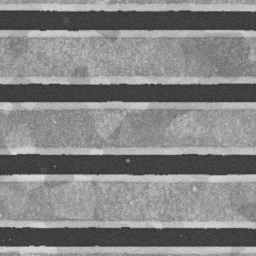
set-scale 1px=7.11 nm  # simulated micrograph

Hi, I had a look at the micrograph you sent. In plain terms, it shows lines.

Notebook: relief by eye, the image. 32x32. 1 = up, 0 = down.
11111111111111111111111111111111
00000000000000000000000000000000
00000000000000000000000000000000
00000000000000000000000000000000
11111111111111111111111111111111
11111111111111111111111111111111
11111111111111111111111111111111
11111111111111111111111111111111
11111111111111111111111111111111
11111111111111111111111111111111
00000000000000000000000000000000
00000000000000000000000000000000
00000000000000000000000000000000
11111111111111111111111111111111
11111111111111111111111111111111
11111111111111111111111111111111
11111111111111111111111111111111
11111111111111111111111111111111
11111111111111111111111111111111
00000000000000000000000000000000
00000000000000000000000000000000
00000000000000000000000000000000
11111111111111111111111111111111
11111111111111111111111111111111
11111111111111111111111111111111
11111111111111111111111111111111
11111111111111111111111111111111
11111111111111111111111111111111
00000000000000000000000000000000
00000000000000000000000000000000
00000000000000000000000000000000
11111111111111111111111111111111